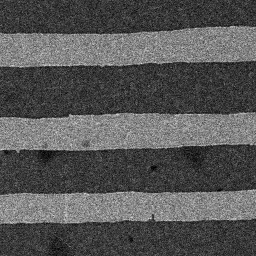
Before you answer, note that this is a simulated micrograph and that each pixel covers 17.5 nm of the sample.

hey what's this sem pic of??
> one or a few lines or trenches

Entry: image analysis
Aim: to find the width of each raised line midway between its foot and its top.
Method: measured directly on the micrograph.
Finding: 541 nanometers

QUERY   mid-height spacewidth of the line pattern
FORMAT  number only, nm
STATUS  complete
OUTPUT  835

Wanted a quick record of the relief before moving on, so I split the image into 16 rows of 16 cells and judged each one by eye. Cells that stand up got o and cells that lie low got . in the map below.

................
................
oooooooooooooooo
oooooooooooooooo
................
................
................
oooooooooooooooo
oooooooooooooooo
................
................
................
oooooooooooooooo
oooooooooooooooo
................
................